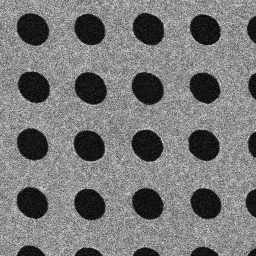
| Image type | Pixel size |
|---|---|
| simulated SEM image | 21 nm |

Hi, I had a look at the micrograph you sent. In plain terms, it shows a regular array of holes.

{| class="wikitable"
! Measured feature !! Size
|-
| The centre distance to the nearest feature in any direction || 1.19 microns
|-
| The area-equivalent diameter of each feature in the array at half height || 666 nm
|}